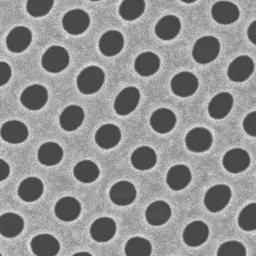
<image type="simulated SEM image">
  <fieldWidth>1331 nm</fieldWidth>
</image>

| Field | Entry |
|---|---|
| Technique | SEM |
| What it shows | a regular array of holes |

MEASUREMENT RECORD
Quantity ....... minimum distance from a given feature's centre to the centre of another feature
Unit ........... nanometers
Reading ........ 212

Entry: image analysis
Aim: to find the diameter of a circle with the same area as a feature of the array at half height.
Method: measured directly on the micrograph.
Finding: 25.9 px